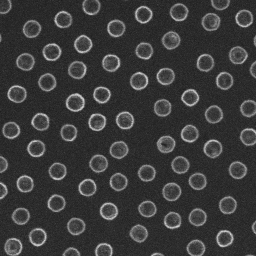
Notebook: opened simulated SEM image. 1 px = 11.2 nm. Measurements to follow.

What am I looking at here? a regular array of raised bodies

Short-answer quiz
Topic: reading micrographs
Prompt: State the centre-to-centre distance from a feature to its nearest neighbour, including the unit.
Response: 313 nm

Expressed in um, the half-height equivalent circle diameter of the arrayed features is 0.189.